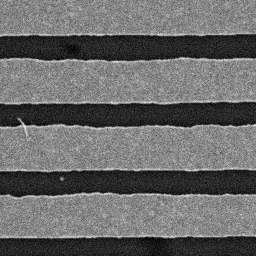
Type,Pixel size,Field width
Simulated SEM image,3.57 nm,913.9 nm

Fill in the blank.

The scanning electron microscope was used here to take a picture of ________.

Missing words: lines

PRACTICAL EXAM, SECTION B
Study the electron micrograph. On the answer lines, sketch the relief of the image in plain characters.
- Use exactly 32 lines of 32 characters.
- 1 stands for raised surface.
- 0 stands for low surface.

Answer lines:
11111111111111111111111111111111
11111111111111111111111111111111
11111111111111111111111111111111
11111111111111111111111111111111
10000000000000000000000000000000
00000000000000000000000000000000
00000000000000000000000000000000
11111000110000000000111111111111
11111111111111111111111111111111
11111111111111111111111111111111
11111111111111111111111111111111
11111111111111111111111111111111
11111111111111111111111111111111
00000000000000000000000000000000
00000000000000000000000000000000
00000000000000000000000000000000
11111111111111111111111111111111
11111111111111111111111111111111
11111111111111111111111111111111
11111111111111111111111111111111
11111111111111111111111111111111
00000000000000000000000000000000
00000000000000000000000000000000
00000000000000000000000000000000
10011111111111111111111111111111
11111111111111111111111111111111
11111111111111111111111111111111
11111111111111111111111111111111
11111111111111111111111111111111
11111111111111111111111111111001
00000000000000000000000000000000
00000000000000000000000000000000